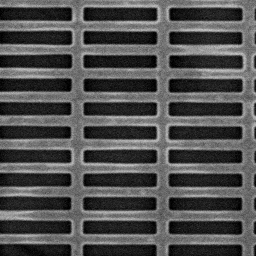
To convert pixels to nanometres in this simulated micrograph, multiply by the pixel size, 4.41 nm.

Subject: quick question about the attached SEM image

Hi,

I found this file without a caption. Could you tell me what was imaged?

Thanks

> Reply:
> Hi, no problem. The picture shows groups of lines, slits or small figures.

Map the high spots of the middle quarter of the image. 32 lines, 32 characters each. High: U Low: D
DDUUUDDDDDDDDDDDDDDDDDDUUUDDDDDD
UUUUUUUUUUUUUUUUUUUUUUUUUUUUUUUU
UUUUUUUUUUUUUUUUUUUUUUUUUUUUUUUU
DUUUUUDDDDDDDDDDDDDDDDUUUUUDDDDD
DDUUUDDDDDDDDDDDDDDDDDDUUUDDDDDD
DDUUUDDDDDDDDDDDDDDDDDDDUUDDDDDD
DDUUUDDDDDDDDDDDDDDDDDDUUUDDDDDD
UUUUUUUUUUUUUUUUUUUUUUUUUUUUUUUU
UUUUUUUUUUUUUUUUUUUUUUUUUUUUUUUU
DUUUUDDDDDDDDDDDDDDDDDDUUUDDDDDD
DDUUUDDDDDDDDDDDDDDDDDDDUUDDDDDD
DDUUUDDDDDDDDDDDDDDDDDDDUUDDDDDD
DDUUUDDDDDDDDDDDDDDDDDDDUUDDDDDD
UUUUUUUUUUUUUUUUUUUUUUUUUUUUUUUU
UUUUUUUUUUUUUUUUUUUUUUUUUUUUUUUU
DUUUUDDDDDDDDDDDDDDDDDDUUUDDDDDD
DDUUUDDDDDDDDDDDDDDDDDDDUUDDDDDD
DDUUUDDDDDDDDDDDDDDDDDDDUUDDDDDD
DDUUUDDDDDDDDDDDDDDDDDDDUUDDDDDD
UUUUUUUUUUUUUUUUUUUUUUUUUUUUUUUU
UUUUUUUUUUUUUUUUUUUUUUUUUUUUUUUU
DDUUUDDDDDDDDDDDDDDDDDDUUUDDDDDD
DDUUUDDDDDDDDDDDDDDDDDDDUUDDDDDD
DDUUUDDDDDDDDDDDDDDDDDDDUUDDDDDD
DDUUUDDDDDDDDDDDDDDDDDDUUUDDDDDD
UUUUUUUUUUUUUUUUUUUUUUUUUUUUUUUU
UUUUUUUUUUUUUUUUUUUUUUUUUUUUUUUU
DDUUUDDDDDDDDDDDDDDDDDDUUUDDDDDD
DDUUUDDDDDDDDDDDDDDDDDDDUUDDDDDD
DDUUUDDDDDDDDDDDDDDDDDDDUUDDDDDD
DDUUUDDDDDDDDDDDDDDDDDDUUUDDDDDD
UUUUUUUUUUUUUUUUUUUUUUUUUUUUUUUU